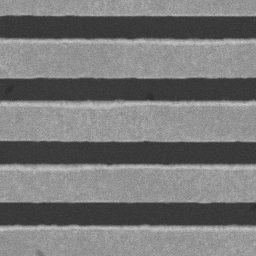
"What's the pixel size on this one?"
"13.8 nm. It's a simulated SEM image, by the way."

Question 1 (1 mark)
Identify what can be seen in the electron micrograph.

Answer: lines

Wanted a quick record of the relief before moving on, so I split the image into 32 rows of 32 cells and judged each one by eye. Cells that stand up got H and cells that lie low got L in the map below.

HHHHHHHHHHHHHHHHHHHHHHHHHHHHHHHH
HHHHHHHHHHHHHHHHHHHHHHHHHHHHHHHH
LLLLLLLLLLLLLLLLLLLLLLLLLLLLLLLL
LLLLLLLLLLLLLLLLLLLLLLLLLLLLLLLL
LLLLLLLLLLLLLLLLLLLLLLLLLLLLLLLL
HHHHHHHHHHHHHHHHHHHHHHHHHHHHHHHH
HHHHHHHHHHHHHHHHHHHHHHHHHHHHHHHH
HHHHHHHHHHHHHHHHHHHHHHHHHHHHHHHH
HHHHHHHHHHHHHHHHHHHHHHHHHHHHHHHH
HHHHHHHHHHHHHHHHHHHHHHHHHHHHHHHH
LLLLLLLLLLLLLLLLLLLLLLLLLLLLLLLL
LLLLLLLLLLLLLLLLLLLLLLLLLLLLLLLL
LLLLLLLLLLLLLLLLLLLLLLLLLLLLLLLL
HHHHHHHHHHHHHHHHHHHHHHHHHHHHHHHH
HHHHHHHHHHHHHHHHHHHHHHHHHHHHHHHH
HHHHHHHHHHHHHHHHHHHHHHHHHHHHHHHH
HHHHHHHHHHHHHHHHHHHHHHHHHHHHHHHH
HHHHHHHHHHHHHHHHHHHHHHHHHHHHHHHH
LLLLLLLLLLLLLLLLLLLLLLLLLLLLLLLL
LLLLLLLLLLLLLLLLLLLLLLLLLLLLLLLL
LLLLLLLLLLLLLLLLLLLLLLLLLLLLLLLL
HHHHHHHHHHHHHHHHHHHHHHHHHHHHHHHH
HHHHHHHHHHHHHHHHHHHHHHHHHHHHHHHH
HHHHHHHHHHHHHHHHHHHHHHHHHHHHHHHH
HHHHHHHHHHHHHHHHHHHHHHHHHHHHHHHH
LLLLLLLLLLLLLLLLLLLLLLLLLLLLLLLL
LLLLLLLLLLLLLLLLLLLLLLLLLLLLLLLL
LLLLLLLLLLLLLLLLLLLLLLLLLLLLLLLL
HHHHHHHHHHHHHHHHHHHHHHHHHHHHHHHH
HHHHHHHHHHHHHHHHHHHHHHHHHHHHHHHH
HHHHHHHHHHHHHHHHHHHHHHHHHHHHHHHH
HHHHHHHHHHHHHHHHHHHHHHHHHHHHHHHH